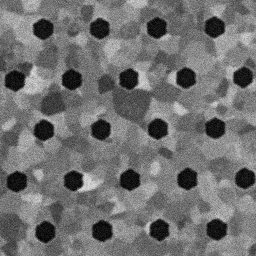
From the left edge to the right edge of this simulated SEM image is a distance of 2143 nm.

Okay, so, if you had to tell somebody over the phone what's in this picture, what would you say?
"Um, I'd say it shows a regular array of holes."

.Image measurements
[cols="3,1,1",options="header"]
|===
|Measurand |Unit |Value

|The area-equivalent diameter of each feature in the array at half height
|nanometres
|186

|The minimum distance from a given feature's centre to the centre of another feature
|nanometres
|476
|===